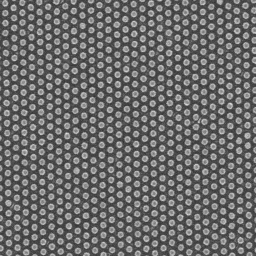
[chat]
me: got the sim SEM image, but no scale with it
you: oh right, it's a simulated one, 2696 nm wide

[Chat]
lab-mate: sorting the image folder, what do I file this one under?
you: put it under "a regular array of raised bodies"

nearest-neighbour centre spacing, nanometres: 102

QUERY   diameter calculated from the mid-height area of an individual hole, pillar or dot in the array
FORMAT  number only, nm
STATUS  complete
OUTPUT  60.6